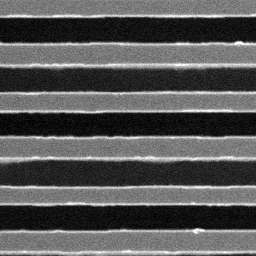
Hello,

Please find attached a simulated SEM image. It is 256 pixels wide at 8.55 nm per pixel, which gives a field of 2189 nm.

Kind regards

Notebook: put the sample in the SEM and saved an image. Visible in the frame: lines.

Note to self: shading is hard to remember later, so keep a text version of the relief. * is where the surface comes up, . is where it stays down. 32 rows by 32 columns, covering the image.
********************************
********************************
................................
................................
................................
*.....*.*..*****......**.***.***
********************************
********************************
................................
................................
................................
................................
********************************
********************************
................................
................................
................................
********************************
********************************
********************************
................................
................................
................................
********************************
********************************
********************************
................................
................................
................................
********************************
********************************
*...*.********..*******.******..